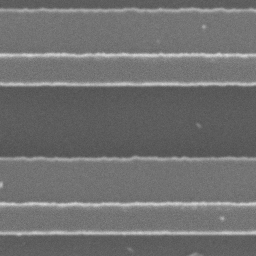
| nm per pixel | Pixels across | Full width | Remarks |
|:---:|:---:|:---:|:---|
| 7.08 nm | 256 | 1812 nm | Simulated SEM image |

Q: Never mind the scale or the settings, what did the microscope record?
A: lines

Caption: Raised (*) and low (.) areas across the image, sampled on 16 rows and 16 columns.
................
****************
****************
****************
****************
................
................
................
................
................
****************
****************
****************
****************
****************
................